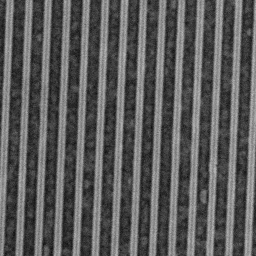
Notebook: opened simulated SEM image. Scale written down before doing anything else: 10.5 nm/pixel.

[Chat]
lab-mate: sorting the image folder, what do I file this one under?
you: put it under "parallel lines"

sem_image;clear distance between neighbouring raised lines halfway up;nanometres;138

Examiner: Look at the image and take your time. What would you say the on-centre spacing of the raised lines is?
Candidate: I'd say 19.1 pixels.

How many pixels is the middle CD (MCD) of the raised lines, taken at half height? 6.12